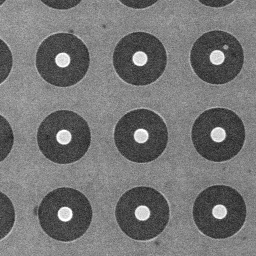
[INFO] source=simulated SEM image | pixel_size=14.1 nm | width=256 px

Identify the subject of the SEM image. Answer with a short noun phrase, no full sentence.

an array of small figures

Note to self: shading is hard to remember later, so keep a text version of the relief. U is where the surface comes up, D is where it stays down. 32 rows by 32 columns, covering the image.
UUUUUUDDDDUUUUUDDDDUUUUUUDDDDUUU
UUUUUUUUUUUUUUUUUUUUUUUUUUUUUUUU
UUUUUUUUUUUUUUUUUUUUUUUUUUUUUUUU
UUUUUUUUUUUUUUUUUUUUUUUUUUUUUUUU
UUUUUUDDDUUUUUUUDDDUUUUUUDDDDUUU
DUUUUDDDDDDUUUUDDDDDUUUUDDDDDDUU
DUUUUDDDDDDUUUDDDDDDDUUUDDDUDDUU
DDUUDDDUUDDUUUDDDUDDDUUUDDUUDDDU
DUUUUDDDDDDUUUDDDDDDDUUUDDDDDDUU
DUUUUDDDDDDUUUUDDDDDUUUUUDDDDDUU
UUUUUUDDDUUUUUUUDDDUUUUUUUDDUUUU
UUUUUUUUUUUUUUUUUUUUUUUUUUUUUUUU
UUUUUUUUUUUUUUUUUUUUUUUUUUUUUUUU
UUUUUUUUUUUUUUUUUUUUUUUUUUUDUUUU
UUUUUUDDDDUUUUUDDDDDUUUUUDDDDDUU
DUUUUDDDDDDUUUUDDDDDDUUUDDDDDDUU
DDUUUDDUDDDUUUDDDUDDDUUUDDDUDDDU
DDUUUDDUUDDUUUDDDUDDDUUUDDDUDDDU
DUUUUDDDDDDUUUUDDDDDDUUUDDDDDDUU
DUUUUUDDDDUUUUUDDDDDUUUUUDDDDUUU
UUUUUUUDUUUUUUUUUUUUUUUUUUUUUUUU
UUUUUUUUUUUUUUUUUUUUUUUUUUUUUUUU
UUUUUUUUUUUUUUUUUUUUUUUUUUUUUUUU
UUUUUUUDDUUUUUUUUDDUUUUUUUDDDUUU
DUUUUUDDDDDUUUUDDDDDUUUUUDDDDDUU
DDUUUDDDDDDUUUUDDDDDDUUUDDDDDDDU
DDUUUDDUUDDDUUDDDUUDDUUUDDDUDDDU
DDUUUDDDDDDUUUDDDDDDDUUUDDDDDDDU
DDUUUDDDDDDUUUUDDDDDDUUUUDDDDDUU
DUUUUUDDDDUUUUUUDDDDUUUUUUDDDUUU
UUUUUUUUUUUUUUUUUUUUUUUUUUUUUUUU
UUUUUUUUUUUUUUUUUUUUUUUUUUUUUUUU